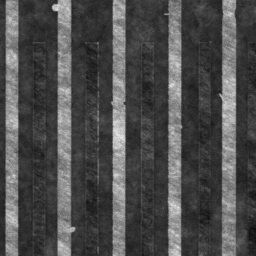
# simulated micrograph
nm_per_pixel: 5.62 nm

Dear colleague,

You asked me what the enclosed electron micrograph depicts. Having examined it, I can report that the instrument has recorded parallel lines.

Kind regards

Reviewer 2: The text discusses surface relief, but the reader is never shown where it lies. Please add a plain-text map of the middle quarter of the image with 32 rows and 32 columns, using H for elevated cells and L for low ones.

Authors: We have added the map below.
HHLLLLHHLLLLHHHLLLLHHHLLLLHHHLLL
HHLLLLHHLLLLHHHLLLLLHHLLLLHHHLLL
HHLLLLHHLLLLHHHLLLLLHHLLLLHHHLLL
HHLLLLHHLLLLHHHLLLLLHHLLLLHHHLLL
HHLLLLHHLLLLHHHLLLLLHHLLLLHHHLLL
HHLLLLHHLLLLHHHLLLLLHHLLLLHHHLLL
HHLLLLHHLLLLHHHLLLLLHHLLLLHHHLLL
HHLLLLHHLLLLHHHLLLLLHHLLLLHHHLLL
HHLLLLHHLLLLHHHLLLLLHHLLLLHHHLLL
HHLLLLHHLLLLHHHLLLLLHHLLLLHHHLLL
HHLLLLHHLLLLHHHLLLLLHHLLLLHHHLLL
HHLLLLHHLLLLHHHLLLLHHHLLLLHHHLLL
HHLLLLHHLLLLHHHLLLLLHHLLLLHHHLLL
HHLLLLHHLLLLHHHLLLLLHHLLLLHHHLLL
HHLLLLHHLLLLHHHLLLLLHHLLLLHHHLLL
HHLLLLHHLLLLHHHLLLLLHHLLLLHHHLLL
HHLLLLHHLLLLHHHLLLLLHHLLLLHHHLLL
HHLLLLHHLLLLHHHLLLLLHHLLLLHHHLLL
HHLLLLHHLLLLHHHLLLLLHHLLLLHHHLLL
HHLLLLHHLLLLHHHLLLLLHHLLLLHHHLLL
HHLLLLHHLLLLHHHLLLLLHHLLLLHHHLLL
HHLLLLHHLLLLHHHLLLLLHHLLLLHHHLLL
HHLLLLHHLLLLHHHLLLLLHHLLLLHHHLLL
HHLLLLHHLLLLHHHLLLLLHHLLLLHHHLLL
HHLLLLHHLLLLHHHLLLLLHHLLLLHHHLLL
HHLLLHHHLLLLHHHLLLLHHHLLLLHHHLLL
HHLLLHHHLLLLHHHLLLLHHHLLLLHHHLLL
HHLLLHHHLLLLHHHLLLLHHHLLLLHHHLLL
HHLLLHHHLLLLHHHLLLLLHHLLLLHHHLLL
HHLLLHHHLLLLHHHLLLLLHHLLLLHHHLLL
HHLLLHHHLLLLHHHLLLLLHHLLLLHHHLLL
HHLLLHHHLLLLHHHLLLLLHHLLLLHHHLLL